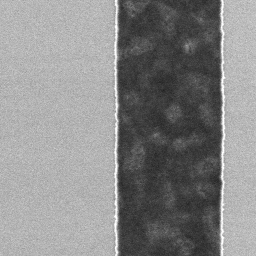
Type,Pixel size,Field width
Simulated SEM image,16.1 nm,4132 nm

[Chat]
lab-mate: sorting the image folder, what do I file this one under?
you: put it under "one or a few lines or trenches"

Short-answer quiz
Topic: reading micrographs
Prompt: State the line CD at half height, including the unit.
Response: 1730 nm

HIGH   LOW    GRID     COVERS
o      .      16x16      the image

.......ooooooo..
.......ooooooo..
.......ooooooo..
.......ooooooo..
.......ooooooo..
.......ooooooo..
.......ooooooo..
.......ooooooo..
.......ooooooo..
.......ooooooo..
.......ooooooo..
.......ooooooo..
.......ooooooo..
.......ooooooo..
.......ooooooo..
.......ooooooo..